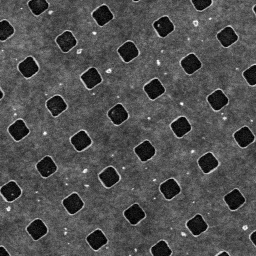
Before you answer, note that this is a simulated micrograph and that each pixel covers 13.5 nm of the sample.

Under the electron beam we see a regular array of holes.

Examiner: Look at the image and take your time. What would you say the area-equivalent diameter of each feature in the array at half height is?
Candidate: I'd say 262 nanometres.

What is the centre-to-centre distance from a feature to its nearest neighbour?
0.597 µm